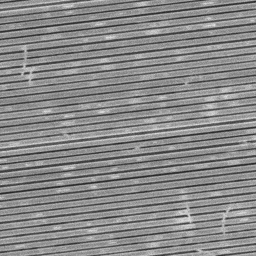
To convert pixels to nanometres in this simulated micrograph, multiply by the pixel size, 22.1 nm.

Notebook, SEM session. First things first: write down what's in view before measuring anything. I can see parallel lines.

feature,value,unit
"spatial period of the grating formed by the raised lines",161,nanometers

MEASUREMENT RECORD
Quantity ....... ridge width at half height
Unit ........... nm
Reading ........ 118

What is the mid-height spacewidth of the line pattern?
57.7 nanometers